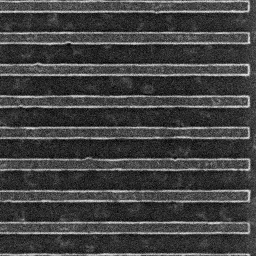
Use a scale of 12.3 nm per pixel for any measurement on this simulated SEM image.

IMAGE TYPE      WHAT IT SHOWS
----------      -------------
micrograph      parallel lines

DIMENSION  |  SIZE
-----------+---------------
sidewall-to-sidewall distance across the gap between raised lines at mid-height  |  0.262 microns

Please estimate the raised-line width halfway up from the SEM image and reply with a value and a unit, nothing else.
126 nm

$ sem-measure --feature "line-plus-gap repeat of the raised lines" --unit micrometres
0.387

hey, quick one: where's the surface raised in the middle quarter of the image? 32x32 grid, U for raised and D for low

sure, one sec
UUUUUUUUUUUUUUUUUUUUUUUUUUUUUUUU
UUUUUUUUUUUUUUUUUUUUUUUUUUUUUUUU
UUUUDUUUUUUUUUUUUUUUUUUUUUUUUUUU
DDDDDDDDDDDDDDDDDDDDDDDDDDDDDDDD
DDDDDDDDDDDDDDDDDDDDDDDDDDDDDDDD
DDDDDDDDDDDDDDDDDDDDDDDDDDDDDDDD
DDDDDDDDDDDDDDDDDDDDDDDDDDDDDDDD
DDDDDDDDDDDDDDDDDDDDDDDDDDDDDDDD
UUUUUUUUUUUUUUUUUUUUUUUUUUUUUUUU
UUUUUUUUUUUUUUUUUUUUUUUUUUUUUUUU
UUUUUUUUUUUUUUUUUUUUUUUUUUUUDDUU
DDDDDDDDDDDDDDDDDDDDDDDDDDDDDDDD
DDDDDDDDDDDDDDDDDDDDDDDDDDDDDDDD
DDDDDDDDDDDDDDDDDDDDDDDDDDDDDDDD
DDDDDDDDDDDDDDDDDDDDDDDDDDDDDDDD
DDDDDDDDDDDDDDDDDDDDDDDDDDDDDDDD
UUUUUUUUUUUUUUUUUUUUUUUUUUUUUUUU
UUUUUUUUUUUUUUUUUUUUUUUUUUUUUUUU
UUUDUUUUUUUUUDDDDUUUDDDDDDDDDDDD
DDDDDDDDDDDDDDDDDDDDDDDDDDDDDDDD
DDDDDDDDDDDDDDDDDDDDDDDDDDDDDDDD
DDDDDDDDDDDDDDDDDDDDDDDDDDDDDDDD
DDDDDDDDDDDDDDDDDDDDDDDDDDDDDDDD
DDDDDDDDDDDDDDDDDDDDDDDDDDDDDDDD
UUUUUUUUUUUUUUUUUUUUUUUUUUUUUUUU
UUUUUUUUUUUUUUUUUUUUUUUUUUUUUUUU
DDDDDDDDDDDDDDDDDDDDDDDDDDDDDDDD
DDDDDDDDDDDDDDDDDDDDDDDDDDDDDDDD
DDDDDDDDDDDDDDDDDDDDDDDDDDDDDDDD
DDDDDDDDDDDDDDDDDDDDDDDDDDDDDDDD
DDDDDDDDDDDDDDDDDDDDDDDDDDDDDDDD
DDDDDDDDDDDDDDDDDDDDDDDDDDDDDDDD